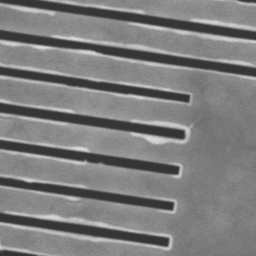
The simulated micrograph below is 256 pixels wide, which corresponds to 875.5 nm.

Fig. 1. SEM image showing parallel lines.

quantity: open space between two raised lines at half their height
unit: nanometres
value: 30.9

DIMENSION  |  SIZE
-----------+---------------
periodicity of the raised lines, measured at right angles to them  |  124 nm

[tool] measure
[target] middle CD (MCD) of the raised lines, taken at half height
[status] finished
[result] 93.1 nanometres